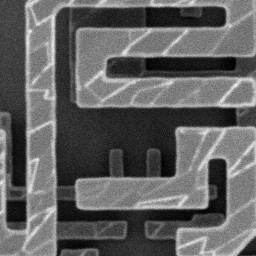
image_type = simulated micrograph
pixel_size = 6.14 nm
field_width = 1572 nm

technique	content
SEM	wiring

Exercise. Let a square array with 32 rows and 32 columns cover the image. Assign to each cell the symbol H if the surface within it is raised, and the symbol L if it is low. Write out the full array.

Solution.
LLLHHHHHHHHHHHHHHHHHHHHHHHHHHHHH
LLLHHHHLLLLLLLLLLLLLLLLLLLLLHHHH
LLLHHHHLLLLLLLLLLLLLLLLLLLLLHHHH
LLLHHHHLLLLLLLLLLLLHHHHHHHHHHHHH
LLLHHHHLLLHHHHHHHHHHHHHHHHHHHHHH
LLLHHHHLLLHHHHHHHHHHHHHHHHHHHHHH
LLLHHHHLLLHHHHHHHHHHHHHHHHHHHHHH
LLLHHHHLLLHHHHLLLLLLLLLLLLLLLLLL
LLLHHHHLLHHHHLLLLLLLLLLLLLLLLLLL
LLLHHHHLLHHHHLLLLLLLLLLLLLLLLLLL
LLLHHHHLLLHHHHHHHHHHHHHHHHHHHHHH
LLLHHHHLLLHHHHHHHHHHHHHHHHHHHHHH
LLLHHHHLLLHHHHHHHHHHHHHHHHHHHHHH
LLLHHHHLLLLLLLLLLLLLLLLLLLLLLLLL
LLLHHHHLLLLLLLLLLLLLLLLLLLLLLLLL
LLLHHHHLLLLLLLLLLLLLLLLLLLLLLLLL
LLLHHHHLLLLLLLLLLLLLLLHHHHHHHHHH
HLLHHHHLLLLLLLLLLLLLLLHHHHHHHHHH
HLLHHHHLLLLLLLLLLLLLLLHHHHHHHHHH
HLLHHHHLLLLLLLLLLLLLLLHHHHHHHHHH
HLLHHHHLLLLLLLLLLLLLLLHHHHLLHHHH
HLLHHHHLLLLLLLLLLLLLLLHHHHLLHHHH
HLLHHHHLLLHHHHHHHHHHHHHHHHLLHHHH
HLLHHHHLLHHHHHHHHHHHHHHHHHLLHHHH
HLLHHHHLLLHHHHHHHHHHHHHHHHLLHHHH
HLLHHHHLLLHHHHHHHHHHHHHHHHLLHHHH
HLLHHHHLLLLLLLLLLLLLLLLLLLLLHHHH
HLLHHHHLLLLLLLLLLLLLLLLLLLLLHHHH
HLLHHHHLLLLLLLLLLLLLLLLLLLLHHHHH
HHHHHHHLLLLLLLLLLLLLLLHHHHHHHHHH
HHHHHHHLLLLLLLLLLLLLLLHHHHHHHHHL
HHHHHHHLLLLLLLLLLLLLLLHHHHHHHHLL